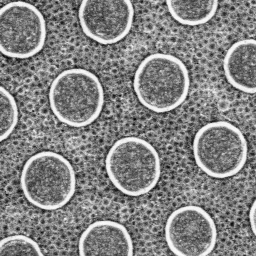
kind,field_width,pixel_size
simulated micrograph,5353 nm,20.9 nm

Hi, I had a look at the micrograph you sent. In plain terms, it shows raised bodies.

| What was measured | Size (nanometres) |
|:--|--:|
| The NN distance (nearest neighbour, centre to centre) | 1810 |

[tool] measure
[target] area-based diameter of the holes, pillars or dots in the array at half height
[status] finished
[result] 1090 nanometers